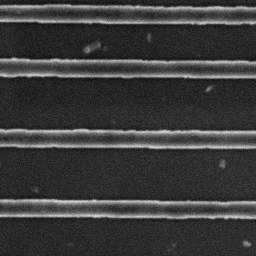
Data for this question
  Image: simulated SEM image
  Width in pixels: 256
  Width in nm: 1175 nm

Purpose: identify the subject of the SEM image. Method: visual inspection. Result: lines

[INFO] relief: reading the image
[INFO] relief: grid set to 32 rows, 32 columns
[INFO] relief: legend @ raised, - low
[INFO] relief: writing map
--------------------------------
@@@@@@@@@@@@@@@@@@@@@@@@@@@@@@@@
@@@@@@@@@@@@@@@@@@@@@@@@@@@@@@@@
--------------------------------
--------------------------------
--------------------------------
--------------------------------
@@@@--@@------------------------
@@@@@@@@@@@@@@@@@@@@@@@@@@@@@@@@
@@-@-@-@@@@@@@@@@@@@@@@@@@@@@@@@
--------------------------------
--------------------------------
--------------------------------
--------------------------------
--------------------------------
--------------------------------
@@@@@@@@@@@@@@@@@@@@@@@@@@@@@@@@
@@@@@@@@@@@@@@@@@@@@@@@@@@@@@@@@
--------------------------------
--------------------------------
--------------------------------
--------------------------------
--------------------------------
--------------------------------
--------------------------------
@@@@@@@@@@@@@@@@@@@@@@@@@@@@@@@@
@@@@@@@@@@@@@@@@@@@@@@@@@@@@@@@@
--------------------------------
--------------------------------
--------------------------------
--------------------------------
--------------------------------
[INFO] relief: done